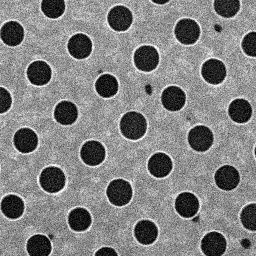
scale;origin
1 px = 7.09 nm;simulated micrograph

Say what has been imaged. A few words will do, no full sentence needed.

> a regular array of holes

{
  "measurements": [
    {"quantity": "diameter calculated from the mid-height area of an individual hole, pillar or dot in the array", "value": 179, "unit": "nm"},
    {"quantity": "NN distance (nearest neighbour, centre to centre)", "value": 339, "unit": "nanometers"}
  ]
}